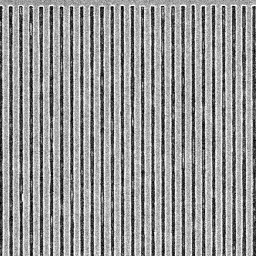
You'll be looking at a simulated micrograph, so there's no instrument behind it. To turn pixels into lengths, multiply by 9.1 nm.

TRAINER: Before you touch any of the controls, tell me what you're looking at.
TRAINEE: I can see parallel lines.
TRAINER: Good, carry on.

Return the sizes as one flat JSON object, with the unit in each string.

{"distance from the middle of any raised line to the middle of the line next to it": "10.1 px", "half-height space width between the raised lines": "0.0398 µm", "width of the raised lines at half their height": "55.7 nanometers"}